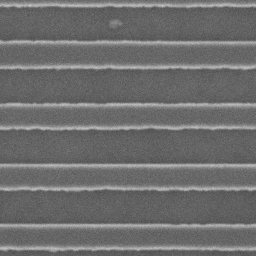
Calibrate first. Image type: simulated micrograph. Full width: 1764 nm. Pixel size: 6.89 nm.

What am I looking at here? lines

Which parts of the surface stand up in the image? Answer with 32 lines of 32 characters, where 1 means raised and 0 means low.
11111111111111111111111111111111
00000000000000000000000000000000
00000000000000000000000000000000
00000000000000000000000000000000
00000000000000000000000000000000
11111111111111111111111111111111
11111111111111111111111111111111
11111111111111111111111111111111
11111110111110111111111110100111
00000000000000000000000000000000
00000000000000000000000000000000
00000000000000000000000000000000
00000000000000000000000000000000
11111111111111111111111111111111
11111111111111111111111111111111
11111111111111111111111111111111
00000000000000000000000000000000
00000000000000000000000000000000
00000000000000000000000000000000
00000000000000000000000000000000
00000000000000000000000000000000
11111111111111111111111111111111
11111111111111111111111111111111
11111111111111111111111111111111
00000000000000000000000000000000
00000000000000000000000000000000
00000000000000000000000000000000
00000000000000000000000000000000
11111111111111111111111111111111
11111111111111111111111111111111
11111111111111111111111111111111
00000000000000000000000000000000